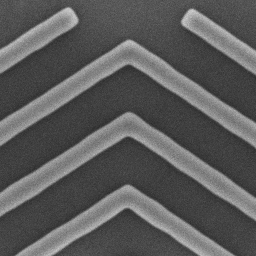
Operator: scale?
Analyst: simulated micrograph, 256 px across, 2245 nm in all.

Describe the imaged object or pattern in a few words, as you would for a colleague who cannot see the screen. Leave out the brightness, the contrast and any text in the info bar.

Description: groups of lines, slits or small figures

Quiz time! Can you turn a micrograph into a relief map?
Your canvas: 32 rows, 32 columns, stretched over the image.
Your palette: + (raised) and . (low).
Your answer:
................................
.......++..............++.......
......++++.............+++......
....+++++..............+++++....
...++++..................++++...
.+++++.........++.........+++++.
++++..........+++++.........++++
+++.........++++++++.........+++
+.........+++++..+++++.........+
.........++++......++++.........
.......+++++........+++++.......
......++++............++++......
....+++++..............++++.....
...++++..................++++...
.+++++.........++.........++++..
++++..........++++..........++++
+++.........++++++++.........+++
+.........+++++..++++..........+
.........++++......++++.........
.......+++++........++++........
......++++............++++......
....+++++..............++++.....
...++++.................+++++...
.+++++.........++.........++++..
++++.........+++++.........+++++
+++.........++++++++.........+++
+.........+++++..++++.........++
.........++++.....+++++.........
.......+++++........++++........
......++++...........+++++......
....+++++..............++++.....
...++++.................+++++...